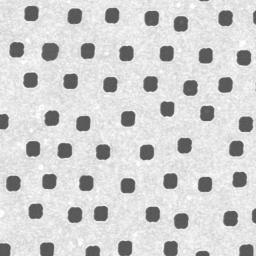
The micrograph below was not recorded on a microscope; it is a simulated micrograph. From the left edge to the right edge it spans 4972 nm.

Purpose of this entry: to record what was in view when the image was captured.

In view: a regular array of holes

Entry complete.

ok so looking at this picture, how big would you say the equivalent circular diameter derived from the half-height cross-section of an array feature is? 319 nanometers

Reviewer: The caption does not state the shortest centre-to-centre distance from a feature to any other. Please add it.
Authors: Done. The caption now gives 646 nanometres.